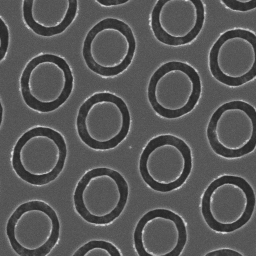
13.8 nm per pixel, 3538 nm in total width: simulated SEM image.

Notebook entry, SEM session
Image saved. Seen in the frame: ring-shaped grooves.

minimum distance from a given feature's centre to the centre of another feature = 1010 nanometres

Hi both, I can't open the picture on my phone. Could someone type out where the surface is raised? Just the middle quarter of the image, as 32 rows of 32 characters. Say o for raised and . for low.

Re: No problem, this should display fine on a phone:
.ooooo....ooo...oooooooo........
..ooooo........oooooooo.........
..ooooooo....ooooooooo...ooooo..
..oooooooooooooooooooo..ooooooo.
..ooooooooooooooooooo...oooooooo
..ooooooooooooooooooo..ooooooooo
..ooooooooooooooooooo..ooooooooo
..oooooo....ooooooooo..ooooooooo
.ooooo........ooooooo..oooooooo.
ooooo..........oooooo...ooooooo.
oooo...oooooo...oooooo..oooooo..
oooo..oooooooo..ooooooo.........
oooo..oooooooo..oooooooo......oo
ooo...ooooooooo..ooooooooo..oooo
ooo...ooooooooo.oooooooooooooooo
ooo...ooooooooo.oooooooooooooooo
ooo...oooooooo..oooooooooooooooo
oooo..ooooooo...oooooooooooooooo
oooo...ooooo...oooooooo......ooo
ooooo.........ooooooo.........oo
.ooooo.......oooooooo....oo....o
.ooooooooooooooooooo...oooooo...
.oooooooooooooooooo...ooooooo...
ooooooooooooooooooo..ooooooooo..
ooooooooooooooooooo..ooooooooo..
ooooooooooooooooooo..ooooooooo..
ooooooo.....ooooooo..ooooooooo..
ooooo.........ooooo..oooooooo..o
oooo...ooooo...ooooo..ooooooo..o
oooo..ooooooo...oooo....ooo...oo
ooo...ooooooo...ooooo........ooo
ooo..ooooooooo..ooooooo....ooooo